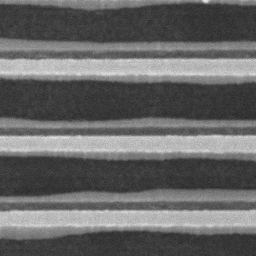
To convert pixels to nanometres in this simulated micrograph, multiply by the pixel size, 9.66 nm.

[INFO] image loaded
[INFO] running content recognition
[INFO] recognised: lines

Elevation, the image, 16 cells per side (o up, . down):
................
................
................
oooooooooooooooo
oooooooooooooooo
................
................
................
oooooooooooooooo
oooooooooooooooo
................
................
oooooooooooooooo
oooooooooooooooo
................
................